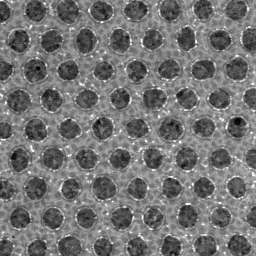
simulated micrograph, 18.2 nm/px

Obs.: a regular array of raised bodies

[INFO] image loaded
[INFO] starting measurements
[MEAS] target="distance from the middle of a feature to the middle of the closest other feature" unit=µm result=0.599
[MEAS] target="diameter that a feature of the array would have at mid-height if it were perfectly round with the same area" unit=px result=22.3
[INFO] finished